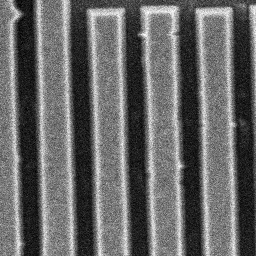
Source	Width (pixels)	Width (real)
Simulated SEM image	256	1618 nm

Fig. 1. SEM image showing parallel lines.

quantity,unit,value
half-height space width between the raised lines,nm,137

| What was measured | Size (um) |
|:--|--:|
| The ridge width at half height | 0.208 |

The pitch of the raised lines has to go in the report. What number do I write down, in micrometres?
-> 0.341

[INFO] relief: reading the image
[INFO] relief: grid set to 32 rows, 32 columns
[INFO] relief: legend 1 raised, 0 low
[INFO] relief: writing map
11000111000000000000000000000000
11000111000111100011110001111000
11000111000111100011110001111000
11000111000111100011110001111000
11000111000111100011110001111000
11000111100111100011110001111000
11000111100111100011110001111000
11000111100111100011110001111000
11000111100111100011110001111000
11000111100111100011110001111000
11000111100111110011110001111000
11000111100011110011110001111000
11000111100011110011110001111000
11000111100011110011110001111000
11000111100011110011110001111000
11000111100011110011110001111000
11000111100011110011110001111000
11000111100011110011110001111000
11000111100011110011111001111000
11000111100011110011111001111000
11000111100011110001111001111000
11000111100011110001111001111000
11000111100011110001111001111000
11000111100011110001111001111000
11000111100011110001111001111000
11000111100011110001111001111000
11000111100011110001111001111000
11100111100011110001111001111100
11100111100011110001111000111100
11100111100011110001111000111100
11100111100011110001111000111100
11100111100011110001111000111100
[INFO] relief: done